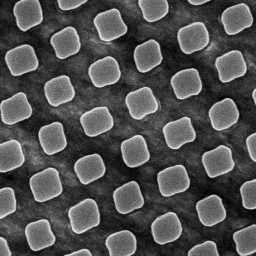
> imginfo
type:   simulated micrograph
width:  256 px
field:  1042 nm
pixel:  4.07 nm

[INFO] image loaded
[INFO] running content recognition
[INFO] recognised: a regular array of raised bodies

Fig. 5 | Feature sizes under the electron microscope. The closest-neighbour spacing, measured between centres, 192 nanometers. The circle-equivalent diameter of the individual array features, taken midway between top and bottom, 0.122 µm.